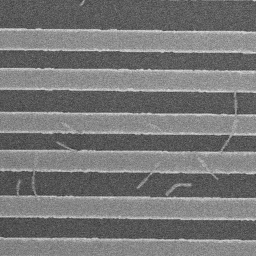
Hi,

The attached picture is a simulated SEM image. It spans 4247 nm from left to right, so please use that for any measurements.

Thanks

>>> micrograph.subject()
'lines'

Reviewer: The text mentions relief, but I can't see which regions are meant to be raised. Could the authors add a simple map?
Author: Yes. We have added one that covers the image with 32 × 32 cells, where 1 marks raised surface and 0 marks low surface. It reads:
00000000000000000000000000000000
00000000000000000000000000000000
00000000000000000000000000000000
00000000000000000000000000000000
11111111111111111111111111111111
11111111111111111111111111111111
00000000000000000000011111111111
00000000000000000000000000000000
00000000000000000000000000000000
11111111111111111111111111111111
11111111111111111111111111111111
00000000000000000000000000000100
00000000000000000000000000000000
00000000000000000000000000000000
11111111111111111111111111111111
11111111111111111111111111111111
11111111111111111111111111111111
00000000000000000000000000000000
00000000000000000000000000000000
11111111111111111111111111111111
11111111111111111111111111111111
00000000000000000011111111111111
00000000000000000000000000000000
00000000000000000000000000000000
00101000000000000000000000000000
11111111111111111111111111111111
11111111111111111111111111111111
00000000000000000000000000000000
00000000000000000000000000000000
00000000000000000000000000000000
11111111111111111111111111111111
11111111111111111111111111111111